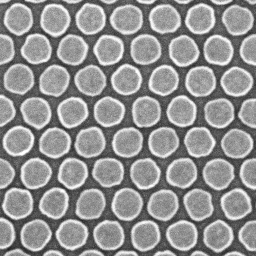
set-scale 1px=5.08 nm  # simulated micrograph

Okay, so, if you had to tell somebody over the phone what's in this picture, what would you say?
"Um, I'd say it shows a regular array of raised bodies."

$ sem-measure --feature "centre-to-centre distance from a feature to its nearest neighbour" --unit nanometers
179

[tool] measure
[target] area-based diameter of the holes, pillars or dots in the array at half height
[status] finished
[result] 29.4 pixels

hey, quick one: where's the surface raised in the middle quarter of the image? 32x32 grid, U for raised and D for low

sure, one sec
DDDDDDUDDDDDDDDUDDDDDDDDDDDDDUDD
DDDDUUUUUDDDDDUUUUDDDDDUUUUUDDDD
UDDUUUUUUUDDDUUUUUUDDDUUUUUUDDDU
UDDUUUUUUUDDUUUUUUUDDDUUUUUUUDDU
UDDUUUUUUUDDUUUUUUUDDDUUUUUUUDDU
UDDUUUUUUUDDUUUUUUUDDDUUUUUUDDDU
DDDDUUUUUUDDDUUUUUDDDDUUUUUUDDDU
DDDDDUUUUDDDDDUUDDDDDDDDUUDDDDDD
DDUDDDDDDDUUDDDDDDDDUDDDDDDDUUUD
UUUUUDDDDUUUUUDDDDUUUUUDDDDUUUUU
UUUUUUDDUUUUUUUDDDUUUUUUDDUUUUUU
UUUUUUDDUUUUUUUDDDUUUUUUDDUUUUUU
UUUUUUDDUUUUUUUDDUUUUUUUDDUUUUUU
UUUUUDDDUUUUUUUDDDUUUUUUDDUUUUUU
UUUUDDDDDUUUUUDDDDUUUUUDDDDUUUUU
UUUDDDDDDDUUDDDDDDUUUDDDDDDDDDDD
DDDDDUUUUDDDDDUUUUUDDDDUUUUDDDDD
UDDDUUUUUDDDDUUUUUUDDDUUUUUUDDDU
UDDUUUUUUUDDDUUUUUUDDUUUUUUUDDUU
UUDUUUUUUUDDUUUUUUUDDUUUUUUUUDUU
UDDUUUUUUUDDUUUUUUUDDUUUUUUUUDDU
UDDUUUUUUUDDDUUUUUUDDDUUUUUUDDDU
DDDDUUUUUDDDDUUUUUDDDDDUUUDDDDDD
DDDDDDDDDDDDDDDDDDDDDDDDDDDDDDDD
UUUUUDDDUUUUUUDDDDUUUUDDDDDUUUUU
UUUUUDDDUUUUUUDDDUUUUUUDDDDUUUUU
UUUUUUDUUUUUUUUDDUUUUUUUDDUUUUUU
UUUUUUDUUUUUUUUDDUUUUUUUDDUUUUUU
UUUUUDDDUUUUUUUDDUUUUUUUDDUUUUUU
UUUUUDDDDUUUUUDDDUUUUUUDDDUUUUUU
UUUUDDDDDDUUDDDDDDUUUUDDDDDDDUUD
DDDDDDDDDDDDDDUUUDDDDDDDDDDDDDDD